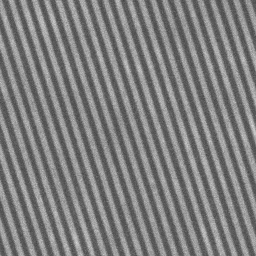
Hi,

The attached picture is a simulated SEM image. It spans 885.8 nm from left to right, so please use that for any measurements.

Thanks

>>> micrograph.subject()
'parallel lines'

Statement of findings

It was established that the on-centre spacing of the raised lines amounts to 11.3 px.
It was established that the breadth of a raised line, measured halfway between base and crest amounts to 0.0173 µm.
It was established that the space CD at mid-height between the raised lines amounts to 20.6 nanometers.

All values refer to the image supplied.